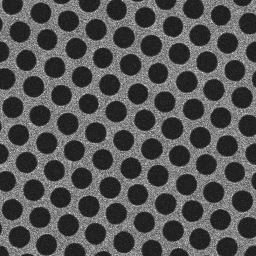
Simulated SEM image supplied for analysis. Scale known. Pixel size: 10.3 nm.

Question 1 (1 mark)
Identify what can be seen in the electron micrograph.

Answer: a regular array of holes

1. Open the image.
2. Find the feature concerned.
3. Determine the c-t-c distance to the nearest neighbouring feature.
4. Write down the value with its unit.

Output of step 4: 286 nanometers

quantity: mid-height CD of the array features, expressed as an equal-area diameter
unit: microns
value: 0.215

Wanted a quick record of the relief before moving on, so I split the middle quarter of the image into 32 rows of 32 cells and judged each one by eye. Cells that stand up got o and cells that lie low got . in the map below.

oooooooo...ooo.....ooo...ooooooo
oo....oooooooo.....oo.....oooooo
oo.....oooooooo...ooo.....ooo...
oo.....oo....oooooooo.....oo....
oo.....oo.....oooooooo...ooo....
ooo...ooo.....ooo...oooooooo....
..ooooooo.....oo.....oooooooo...
..oooooooo...ooo.....oo....ooooo
..oo....oooooooo.....oo.....oooo
.ooo.....ooo..ooo...ooo.....oo..
oooo.....oo....oooooooo.....oo..
oooo....oo......oooo.ooo...ooo..
..oooo.ooo......oo....oooooooo..
...oooooooo....ooo.....ooo..ooo.
....ooooooooo.oooo.....oo....ooo
....oo....oooooooo....oo......oo
...ooo.....oooooooo..ooo......oo
..ooo......oo....oooooooo.....oo
oooooo....oo.....ooooooooo..ooo.
o...ooo..ooo.....ooo....oooooooo
.....oooooooo....oo......ooo..oo
.....oooo..ooo..ooo......oo....o
.....oo.....oooooooo....oo.....o
o...ooo.....oooo..oo...ooo.....o
ooooooo.....ooo....oooooooo....o
oooooooo....oo.....ooo...ooo..oo
ooo...oooo.ooo.....oo.....oooooo
oo.....ooooooo.....oo.....oooooo
oo.....ooo...ooo..ooo.....ooo...
oo.....oo.....ooooooo.....oo....
ooo...ooo.....ooo...ooo.oooo....
.oooooooo.....oo.....ooooooo....